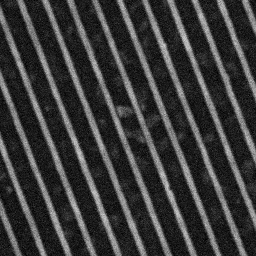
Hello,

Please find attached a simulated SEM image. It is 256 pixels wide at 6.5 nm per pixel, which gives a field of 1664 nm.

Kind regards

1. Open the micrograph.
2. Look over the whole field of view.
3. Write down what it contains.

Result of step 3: parallel lines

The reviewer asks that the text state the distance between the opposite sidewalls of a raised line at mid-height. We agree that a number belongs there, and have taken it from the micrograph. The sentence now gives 25.8 nm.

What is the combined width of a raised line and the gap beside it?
151 nm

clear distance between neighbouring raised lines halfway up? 124 nm